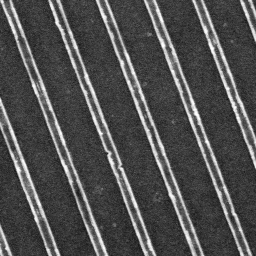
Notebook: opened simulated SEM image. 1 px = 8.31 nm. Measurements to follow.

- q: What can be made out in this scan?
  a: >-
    parallel lines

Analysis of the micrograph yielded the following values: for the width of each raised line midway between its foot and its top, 0.0719 microns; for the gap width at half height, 301 nanometres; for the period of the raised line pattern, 0.373 micrometres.